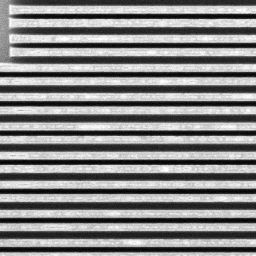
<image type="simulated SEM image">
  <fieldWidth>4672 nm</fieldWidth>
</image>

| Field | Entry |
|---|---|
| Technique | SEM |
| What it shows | parallel lines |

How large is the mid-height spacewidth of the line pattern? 4.88 px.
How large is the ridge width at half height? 7.75 pixels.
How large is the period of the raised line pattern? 14.6 px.